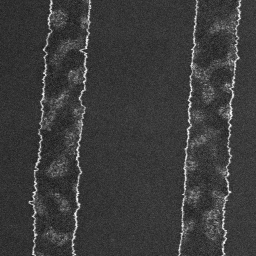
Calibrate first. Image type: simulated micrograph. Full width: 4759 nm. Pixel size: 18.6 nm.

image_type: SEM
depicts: one or a few lines or trenches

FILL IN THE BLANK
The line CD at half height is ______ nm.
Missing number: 758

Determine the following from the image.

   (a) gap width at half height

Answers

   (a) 1.98 microns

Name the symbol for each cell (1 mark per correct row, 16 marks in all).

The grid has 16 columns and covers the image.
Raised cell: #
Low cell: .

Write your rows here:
...###......###.
...###......###.
...##.......###.
...##.......###.
...##.......###.
...##.......###.
...##.......##..
...##.......##..
...##.......##..
..###.......##..
..###.......##..
..###.......##..
..###......###..
..###......###..
..###......###..
..###......###..